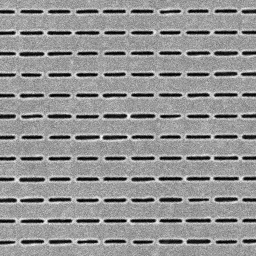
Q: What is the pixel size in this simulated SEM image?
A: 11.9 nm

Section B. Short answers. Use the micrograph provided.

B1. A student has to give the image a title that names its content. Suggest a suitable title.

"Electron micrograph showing a regular array of holes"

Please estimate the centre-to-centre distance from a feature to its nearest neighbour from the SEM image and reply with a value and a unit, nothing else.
0.245 µm